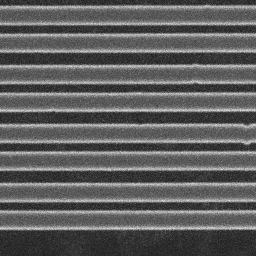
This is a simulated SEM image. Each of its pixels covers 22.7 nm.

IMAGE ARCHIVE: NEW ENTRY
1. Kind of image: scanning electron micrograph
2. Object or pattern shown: parallel lines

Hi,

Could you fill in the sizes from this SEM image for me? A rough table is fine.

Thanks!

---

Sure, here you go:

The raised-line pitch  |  666 nanometres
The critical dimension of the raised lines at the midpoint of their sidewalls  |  409 nanometres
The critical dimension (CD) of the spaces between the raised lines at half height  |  0.216 micrometres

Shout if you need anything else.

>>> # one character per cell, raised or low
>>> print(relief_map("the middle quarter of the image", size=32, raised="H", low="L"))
LLHHHHHHHHHHHHHHHHHHHHHHHHHHHHHH
HHHHHHHHHHHHHHHHHHHHHHHHHHHHHHHH
HHHHHHHHHHHHHHHHHHHHHHHHHHHHHHHH
HHHHHHHHHHHHHHHHHHHHHHHHHHHHHHHH
HHHHHHHHHHHHHHHHHHHHHHHHHHHHHHHH
LLLLLLLLLLLLLLLLLLLLLLLLLLLLLLLL
LLLLLLLLLLLLLLLLLLLLLLLLLLLLLLLL
HHHHHHHHHHHHHHHHHHHHHHHHHHHHHHHH
HHHHHHHHHHHHHHHHHHHHHHHHHHHHHHHH
HHHHHHHHHHHHHHHHHHHHHHHHHHHHHHHH
HHHHHHHHHHHHHHHHHHHHHHHHHHHHHHHH
HHHHHHHHHHHHHHHHHHHHHHHHHHHHHHHH
LLLLLLLLLLLLLLLLLLLLLLLLLLLLLLLL
LLLLLLLLLLLLLLLLLLLLLLLLLLLLLLLL
LLLLLLLLLLLLLLLLLLLLLLLLLLLLLLLL
HHHHHHHHHHHHHHHHHHHHHHHHHHHHHHHH
HHHHHHHHHHHHHHHHHHHHHHHHHHHHHHHH
HHHHHHHHHHHHHHHHHHHHHHHHHHHHHHHH
HHHHHHHHHHHHHHHHHHHHHHHHHHHHHHHH
HHHHHHHHHHHHHLLLLLLLLLLLLLLLLLLL
LLLLLLLLLLLLLLLLLLLLLLLLLLLLLLLL
LLLLLLLLLLLLLLLLLLLLLLLLLLLLLLLL
HHHHHHHHHHHHHHHHHHHHHHHHHHHHHHHH
HHHHHHHHHHHHHHHHHHHHHHHHHHHHHHHH
HHHHHHHHHHHHHHHHHHHHHHHHHHHHHHHH
HHHHHHHHHHHHHHHHHHHHHHHHHHHHHHHH
LLLLLLLLLLLHLLLLLLLLLLLLLLLLLLLL
LLLLLLLLLLLLLLLLLLLLLLLLLLLLLLLL
LLLLLLLLLLLLLLLLLLLLLLLLLLLLLLLL
LLLLLLLLLLLLLLLLLLLLLLLLLLLLLLLL
HHHHHHHHHHHHHHHHHHHHHHHHHHHHHHHH
HHHHHHHHHHHHHHHHHHHHHHHHHHHHHHHH